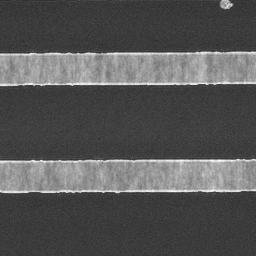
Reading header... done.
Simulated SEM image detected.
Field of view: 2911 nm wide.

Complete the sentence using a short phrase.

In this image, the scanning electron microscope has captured lines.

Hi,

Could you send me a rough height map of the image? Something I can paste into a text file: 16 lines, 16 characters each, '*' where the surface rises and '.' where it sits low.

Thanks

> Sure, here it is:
................
................
................
****************
****************
................
................
................
................
................
****************
****************
................
................
................
................